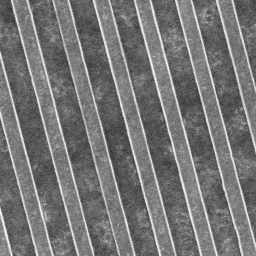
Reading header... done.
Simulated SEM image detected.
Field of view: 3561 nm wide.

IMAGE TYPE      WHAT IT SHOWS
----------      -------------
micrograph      parallel lines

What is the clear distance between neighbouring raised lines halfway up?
333 nanometres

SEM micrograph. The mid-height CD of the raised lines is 15.4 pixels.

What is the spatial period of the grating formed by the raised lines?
552 nanometres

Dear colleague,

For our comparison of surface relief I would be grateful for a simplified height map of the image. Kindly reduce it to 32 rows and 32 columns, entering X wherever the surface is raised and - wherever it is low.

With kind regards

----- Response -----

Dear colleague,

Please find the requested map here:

--XX---XX---XX---XX---XX---XX---
--XX---XX---XX---XX---XX---XX---
--XX---XX---XX---XX----XX---XX--
--XX---XX----XX---XX---XX---XX--
---XX---XX---XX---XX---XX---XX--
---XX---XX---XX---XX---XX---XX--
---XX---XX---XX----XX---XX---XX-
---XX----X----XX---XX---XX---XX-
----XX---XX---XX---XX---XX---XX-
X---XX---XX---XX---XX---XX----X-
X---XX---XX---XX----XX---XX---XX
X---XX----XX---XX---XX---XX---XX
XX---XX---XX---XX---XX---XX---XX
XX---XX---XX---XX---XX---XX----X
XX---XX---XX---XX----XX---XX---X
XX---XX----XX---XX---XX---XX---X
-XX---XX---XX---XX---XX---XX---X
-XX---XX---XX---XX---XX----X----
-XX---XX---XX---XX----XX---XX---
-XX---XXX---XX---XX---XX---XX---
--XX---XX---XX---XX---XX---XX---
--XX---XX---XX---XX---XX----XX--
--XX---XX---XX----XX---XX---XX--
--XX----X----XX---XX---XX---XX--
---XX---XX---XX---XX---XX---XX--
---XX---XX---XX---XX---XX----XX-
---XX---XX---XX----XX---XX---XX-
---XX----XX---XX---XX---XX---XX-
X---XX---XX---XX---XX---XX---XX-
X---XX---XX---XX---XX---XXX---XX
X---XX---XX----X----XX---XX---XX
X----X----XX---XX---XX---XX---XX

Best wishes